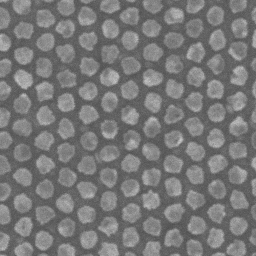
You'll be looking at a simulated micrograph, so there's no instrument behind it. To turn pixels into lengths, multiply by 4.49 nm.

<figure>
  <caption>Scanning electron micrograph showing a regular array of raised bodies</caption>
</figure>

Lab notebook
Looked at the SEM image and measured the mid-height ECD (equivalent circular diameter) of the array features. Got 0.0789 microns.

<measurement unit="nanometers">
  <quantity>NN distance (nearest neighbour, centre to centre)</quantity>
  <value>106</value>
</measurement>